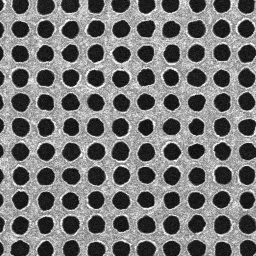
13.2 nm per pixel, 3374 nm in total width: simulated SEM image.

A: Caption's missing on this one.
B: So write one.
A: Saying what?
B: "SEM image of a regular array of holes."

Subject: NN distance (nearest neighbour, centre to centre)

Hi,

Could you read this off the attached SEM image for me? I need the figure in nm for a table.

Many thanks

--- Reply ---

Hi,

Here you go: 318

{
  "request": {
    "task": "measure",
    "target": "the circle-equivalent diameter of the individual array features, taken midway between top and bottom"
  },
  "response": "228 nanometres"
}